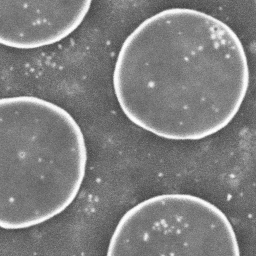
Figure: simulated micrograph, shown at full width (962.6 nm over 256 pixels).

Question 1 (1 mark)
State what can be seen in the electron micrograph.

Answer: raised bodies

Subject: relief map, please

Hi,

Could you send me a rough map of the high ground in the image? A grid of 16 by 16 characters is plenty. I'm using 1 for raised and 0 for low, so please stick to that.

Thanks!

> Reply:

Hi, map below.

1111100000000000
1111100001111100
1111000011111110
0000000011111110
0000000111111110
0000000111111110
1110000011111110
1111000011111100
1111100000111000
1111100000000000
1111100000000000
1111100000000000
1111000001110000
1110000011111100
0000000111111100
0000000111111110